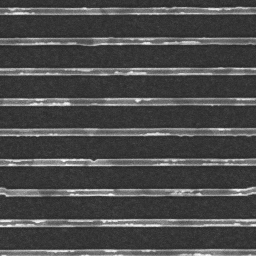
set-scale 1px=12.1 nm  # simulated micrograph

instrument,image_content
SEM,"parallel lines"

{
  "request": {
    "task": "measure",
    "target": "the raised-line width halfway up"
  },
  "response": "81.7 nm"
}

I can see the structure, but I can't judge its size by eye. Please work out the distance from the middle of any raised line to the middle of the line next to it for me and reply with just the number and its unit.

367 nm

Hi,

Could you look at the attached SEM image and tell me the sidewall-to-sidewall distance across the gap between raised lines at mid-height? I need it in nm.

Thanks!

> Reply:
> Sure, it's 283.